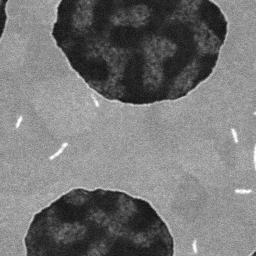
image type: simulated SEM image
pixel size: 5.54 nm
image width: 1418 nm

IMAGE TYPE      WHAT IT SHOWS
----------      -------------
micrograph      holes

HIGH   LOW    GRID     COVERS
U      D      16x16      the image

UUUUDDDDDDDDDDUU
UUUDDDDDDDDDDDUU
UUUDDDDDDDDDDDUU
UUUUDDDDDDDDDDUU
UUUUUDDDDDDDDUUU
UUUUUUDDDDDDUUUU
UUUUUUUUDUUUUUUU
UUUUUUUUUUUUUUUU
UUUUUUUUUUUUUUUU
UUUUUUUUUUUUUUUU
UUUUUUUUUUUUUUUU
UUUUUUUUUUUUUUUU
UUUDDDDDDUUUUUUU
UUDDDDDDDDUUUUUU
UUDDDDDDDDDUUUUU
UUDDDDDDDDDUUUUU